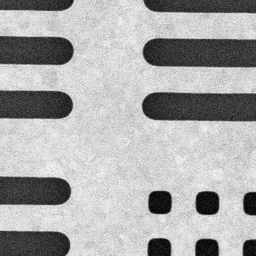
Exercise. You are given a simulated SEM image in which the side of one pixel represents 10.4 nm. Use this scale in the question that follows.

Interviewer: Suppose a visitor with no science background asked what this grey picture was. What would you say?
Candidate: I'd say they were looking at groups of lines, slits or small figures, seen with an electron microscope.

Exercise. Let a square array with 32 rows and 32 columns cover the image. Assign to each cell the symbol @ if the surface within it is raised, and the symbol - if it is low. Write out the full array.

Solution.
---------@@@@@@@@@--------------
@@@@@@@@@@@@@@@@@@@@------------
@@@@@@@@@@@@@@@@@@@@@@@@@@@@@@@@
@@@@@@@@@@@@@@@@@@@@@@@@@@@@@@@@
---@@@@@@@@@@@@@@@@@@@@@@@@@@@@@
---------@@@@@@@@@--------------
---------@@@@@@@@@--------------
---------@@@@@@@@@--------------
@@@@@@@@@@@@@@@@@@@@@@@@@@------
@@@@@@@@@@@@@@@@@@@@@@@@@@@@@@@@
@@@@@@@@@@@@@@@@@@@@@@@@@@@@@@@@
--------@@@@@@@@@@@----@@@@@@@@@
---------@@@@@@@@@--------------
---------@@@@@@@@@--------------
--------@@@@@@@@@@--------------
@@@@@@@@@@@@@@@@@@@@@@@@@@@@@@@@
@@@@@@@@@@@@@@@@@@@@@@@@@@@@@@@@
@@@@@@@@@@@@@@@@@@@@@@@@@@@@@@@@
@@@@@@@@@@@@@@@@@@@@@@@@@@@@@@@@
@@@@@@@@@@@@@@@@@@@@@@@@@@@@@@@@
@@@@@@@@@@@@@@@@@@@@@@@@@@@@@@@@
@@@@@@@@@@@@@@@@@@@@@@@@@@@@@@@@
--------@@@@@@@@@@@@@@@@@@@@@@@@
---------@@@@@@@@@@@@@@@@@@@@@@@
---------@@@@@@@@@@--@@@@--@@@@-
--------@@@@@@@@@@----@@---@@@--
@@@@@@@@@@@@@@@@@@@--@@@@--@@@@-
@@@@@@@@@@@@@@@@@@@@@@@@@@@@@@@@
@@@@@@@@@@@@@@@@@@@@@@@@@@@@@@@@
--------@@@@@@@@@@@@@@@@@@@@@@@@
---------@@@@@@@@@---@@@---@@@--
---------@@@@@@@@@---@@@---@@@--